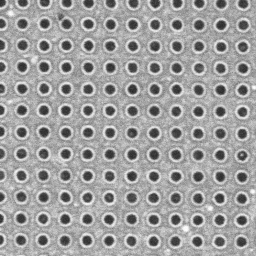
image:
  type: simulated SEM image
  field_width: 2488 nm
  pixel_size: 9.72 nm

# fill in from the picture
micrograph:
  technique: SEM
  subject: a regular array of raised bodies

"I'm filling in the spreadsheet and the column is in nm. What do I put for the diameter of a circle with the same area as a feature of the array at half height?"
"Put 130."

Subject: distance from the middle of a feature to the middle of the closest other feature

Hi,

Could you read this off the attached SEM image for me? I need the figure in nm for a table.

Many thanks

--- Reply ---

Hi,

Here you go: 209